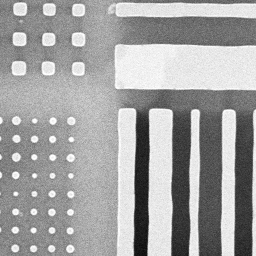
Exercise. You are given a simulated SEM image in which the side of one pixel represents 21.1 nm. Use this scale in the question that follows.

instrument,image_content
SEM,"groups of lines, slits or small figures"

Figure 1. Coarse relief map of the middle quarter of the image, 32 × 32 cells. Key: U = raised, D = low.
DDUUUDDDDDDDDUUUUUUUUUUUUUUUUUUU
DDUUUDDDDDDDDUUUUUUUUUUUUUUUUUUU
DDDUUDDDDDDDDUUUUUUUUUUUUUUUUUUU
DDDDDDDDDDDDDUUUUUUUUUUUUUUUUUUU
DDDDDDDDDDDDDUUUUUUUUUUUUUUUUUUU
DDDDDDDDDDDDDUUUUUUUUUUUUUUUUUUU
DDDDDDDDDDDDDDDDDDDDDDDDDDDDDDDD
DDDDDDDDDDDDDDDDDDDDDDDDDDDDDDDD
DDDDDDDDDDDDDDDDDDDDDDDDDDDDDDDD
DDDDDDDDDDDDDDDDDDDDDDDDDDDDDDDD
DDDDDDDDDDDDDDDDDDDDDDDDDDDDDDDD
DDDDDDDDDDDDDDUUUUDDDDUUUUDDDDDD
DDDDDDDDDDDDDDUUUUDDDUUUUUUDDDDD
DDDDDDDDDDDDDDUUUUDDDUUUUUUDDDDD
DUUDDDDDDDDDDDUUUUDDDUUUUUUDDDDD
DDDDDDDDDDDDDDUUUUDDDDUUUUUDDDDD
DDDDDDDDDDDDDDUUUUDDDDUUUUUDDDDD
DDDDDDDDDDDDDDUUUUDDDDUUUUUDDDDD
DDDDDDDDDDDDDDUUUUDDDDUUUUUDDDDD
DDDDDDDDDDDDDDUUUUDDDDUUUUUDDDDD
DDDDDDDDDDDDDDUUUUDDDDUUUUUDDDDD
DDDDDDDDDDDDDDUUUUDDDDUUUUUDDDDD
DDDDDDDDDDDDDDUUUUDDDDUUUUUDDDDD
DUDDDDDDDDDDDDUUUUDDDDUUUUUDDDDD
DDDDDDDDDDDDDDUUUUDDDUUUUUUDDDDD
DDDDDDDDDDDDDDUUUUDDDUUUUUUDDDDU
DDDDDDDDDDDDDDUUUDDDDUUUUUUDDDDU
DDDDDDDDDDDDDDUUUDDDDUUUUUUDDDDU
DDDDDDDDDDDDDDUUUDDDDUUUUUUDDDDU
DDDDDDDDDDDDDDUUUDDDDUUUUUUDDDDU
DDDDDDDDDDDDDDUUUDDDDUUUUUUDDDDU
DDDDDDDDDDDDDDUUUDDDDUUUUUUDDDDD